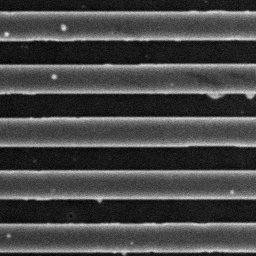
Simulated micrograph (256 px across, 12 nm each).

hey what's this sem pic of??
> lines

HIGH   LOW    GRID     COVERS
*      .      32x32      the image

................................
.......................**.***.*.
********************************
********************************
********************************
................................
................................
................................
********************************
********************************
********************************
********************************
................................
................................
................................
********************************
********************************
********************************
................................
................................
................................
********************************
********************************
********************************
********************************
................................
................................
................................
********************************
********************************
********************************
..............*.................